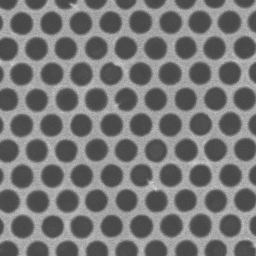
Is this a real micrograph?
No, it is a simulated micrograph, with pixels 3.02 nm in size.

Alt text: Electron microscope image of a regular array of holes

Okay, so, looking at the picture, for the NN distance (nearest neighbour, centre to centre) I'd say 88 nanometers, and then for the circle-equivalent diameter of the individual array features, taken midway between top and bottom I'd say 68.6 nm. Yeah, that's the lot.